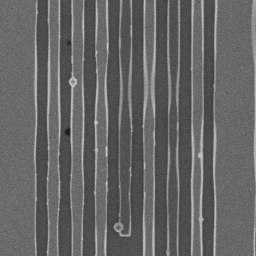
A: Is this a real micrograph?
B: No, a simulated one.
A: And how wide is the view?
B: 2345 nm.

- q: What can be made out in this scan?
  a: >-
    groups of lines, slits or small figures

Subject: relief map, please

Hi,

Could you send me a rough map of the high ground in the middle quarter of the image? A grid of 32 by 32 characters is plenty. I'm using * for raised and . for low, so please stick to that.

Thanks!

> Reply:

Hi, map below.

..***...***...***...***...***...
..***...***...***...***...***...
..***...**....***...**....***...
..***...**....***...**....**....
.****...**....***...**....**....
..***...**....**....**....**....
..***...**....**....**.....*....
..***...**....**....**.....*....
..***...**....**....**....**....
..***...***...***...**....**....
..***...***...***...***...**....
..***...***...***...***...**....
..***...***...***...***...**....
..***...***...***...***...**....
..***...***...***...***...**....
..***...***...***...***...**....
..***...***...***...***...**....
..***...***...***...***...**....
..***...***...***...***...**....
..***...***...***...***...**....
..***...***...***...***...**....
..***...***...***...***...**....
..***...***...***...***...**....
..***...***...***...***...**....
..***...***...***...***...**....
..***...***...***...***...**....
..***...***...***...***...**....
..***...***...***...***...**....
..***...***...***...***...**....
..***...***...***...***...**....
..***...***...**....***...***...
..***...***...**....***...***...